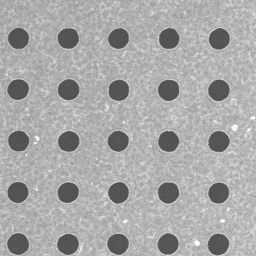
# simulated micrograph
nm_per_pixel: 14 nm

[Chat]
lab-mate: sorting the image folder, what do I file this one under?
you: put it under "a regular array of holes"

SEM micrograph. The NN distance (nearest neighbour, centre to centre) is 0.699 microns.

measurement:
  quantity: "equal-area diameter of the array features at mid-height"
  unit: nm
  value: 296